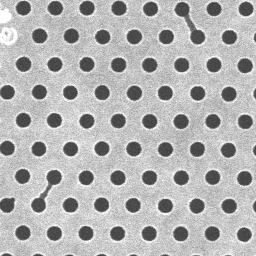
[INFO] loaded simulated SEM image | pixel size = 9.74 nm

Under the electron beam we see a regular array of holes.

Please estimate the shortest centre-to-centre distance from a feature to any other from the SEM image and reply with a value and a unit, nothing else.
307 nm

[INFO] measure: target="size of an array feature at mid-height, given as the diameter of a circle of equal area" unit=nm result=151